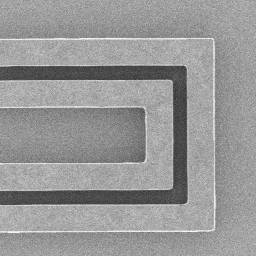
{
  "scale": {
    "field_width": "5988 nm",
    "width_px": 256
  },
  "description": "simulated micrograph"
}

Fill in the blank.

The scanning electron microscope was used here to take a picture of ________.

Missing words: groups of lines, slits or small figures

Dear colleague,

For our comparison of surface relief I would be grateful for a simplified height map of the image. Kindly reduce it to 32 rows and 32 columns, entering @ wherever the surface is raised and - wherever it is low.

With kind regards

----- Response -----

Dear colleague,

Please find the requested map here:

--------------------------------
--------------------------------
--------------------------------
--------------------------------
--------------------------------
@@@@@@@@@@@@@@@@@@@@@@@@@@@-----
@@@@@@@@@@@@@@@@@@@@@@@@@@@-----
@@@@@@@@@@@@@@@@@@@@@@@@@@@-----
-----------------------@@@@-----
-----------------------@@@@-----
@@@@@@@@@@@@@@@@@@@@@--@@@@-----
@@@@@@@@@@@@@@@@@@@@@--@@@@-----
@@@@@@@@@@@@@@@@@@@@@--@@@@-----
------------------@@@@-@@@@-----
------------------@@@@-@@@@-----
------------------@@@@-@@@@-----
------------------@@@@-@@@@-----
------------------@@@@-@@@@-----
------------------@@@@-@@@@-----
------------------@@@@-@@@@-----
-----------@@@@@@@@@@--@@@@-----
@@@@@@@@@@@@@@@@@@@@@@-@@@@-----
@@@@@@@@@@@@@@@@@@@@@@-@@@@-----
@@@@@@@@@@@@@@@@@@@@@--@@@@-----
-----------------------@@@@-----
-----------------------@@@@-----
@@@@@@@@@@@@@@@@@@@@@@@@@@@-----
@@@@@@@@@@@@@@@@@@@@@@@@@@@-----
@@@@@@@@@@@@@@@@@@@@@@@@@@@-----
--------------------------------
--------------------------------
--------------------------------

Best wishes